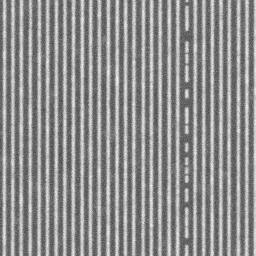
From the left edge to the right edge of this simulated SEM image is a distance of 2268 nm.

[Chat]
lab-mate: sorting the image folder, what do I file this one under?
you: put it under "parallel lines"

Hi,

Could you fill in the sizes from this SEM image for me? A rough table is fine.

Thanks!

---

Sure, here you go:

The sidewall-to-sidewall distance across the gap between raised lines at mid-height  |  56.5 nm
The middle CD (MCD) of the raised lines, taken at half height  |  21 nanometres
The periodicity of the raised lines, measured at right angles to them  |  76.7 nanometres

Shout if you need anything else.